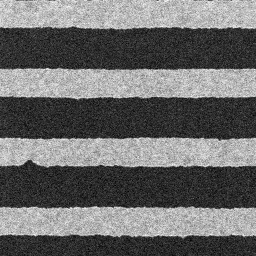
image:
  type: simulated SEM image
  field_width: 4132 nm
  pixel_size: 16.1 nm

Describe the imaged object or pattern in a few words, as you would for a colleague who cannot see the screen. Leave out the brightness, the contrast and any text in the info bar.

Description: one or a few lines or trenches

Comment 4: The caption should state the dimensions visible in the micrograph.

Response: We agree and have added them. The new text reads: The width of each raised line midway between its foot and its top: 436 nanometers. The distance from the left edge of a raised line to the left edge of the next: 1120 nanometres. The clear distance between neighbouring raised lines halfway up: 678 nanometers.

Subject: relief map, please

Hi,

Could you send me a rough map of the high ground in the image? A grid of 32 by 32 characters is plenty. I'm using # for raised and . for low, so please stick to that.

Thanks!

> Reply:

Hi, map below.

################################
################################
################################
...........#####................
................................
................................
................................
................................
................................
################################
################################
################################
................................
................................
................................
................................
................................
###########################.####
################################
################################
###..###########################
................................
................................
................................
................................
................................
################################
################################
################################
..............#...#...#.........
................................
................................